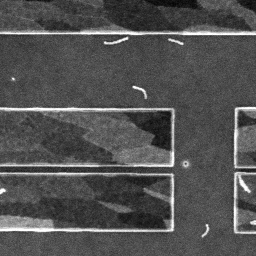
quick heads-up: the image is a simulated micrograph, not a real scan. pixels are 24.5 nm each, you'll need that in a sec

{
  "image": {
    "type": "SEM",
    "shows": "wiring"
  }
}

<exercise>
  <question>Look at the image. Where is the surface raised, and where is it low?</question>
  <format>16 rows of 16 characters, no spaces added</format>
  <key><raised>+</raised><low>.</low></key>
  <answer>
++++++++++++++++
++++++++++++++++
................
................
................
................
................
+++++++++++....+
+++++++++++....+
+++++++++++....+
++.++++++......+
+++++++++++....+
+++++++++++....+
+++++++++++....+
...............+
................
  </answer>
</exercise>